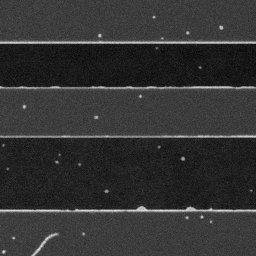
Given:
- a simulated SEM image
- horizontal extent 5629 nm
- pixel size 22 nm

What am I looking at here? lines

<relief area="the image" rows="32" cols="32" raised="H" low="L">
HHHHHHHHHHHHHHHHHHHHHHHHHHHHHHHH
HHHHHHHHHHHHHHHHHHHHHHHHHHHHHHHH
HHHHHHHHHHHHHHHHHHHHHHHHHHHHHHHH
HHHHHHHHHHHHHHHHHHHHHHHHHHHHHHHH
HHHHHHHHHHHHHHHHHHHHHHHHHHHHHHHH
LLLLLLLLLLLLLLLLLLLLLLLLLLLLLLLL
LLLLLLLLLLLLLLLLLLLLLLLLLLLLLLLL
LLLLLLLLLLLLLLLLLLLLLLLLLLLLLLLL
LLLLLLLLLLLLLLLLLLLLLLLLLLLLLLLL
LLLLLLLLLLLLLLLLLLLLLLLLLLLLLLLL
LLLLLLLLLLLLLLLLLLLLLLLLLLLLLLLL
HHHHHHHHHHHHHHHHHHHHHHHHHHHHHHHH
HHHHHHHHHHHHHHHHHHHHHHHHHHHHHHHH
HHHHHHHHHHHHHHHHHHHHHHHHHHHHHHHH
HHHHHHHHHHHHHHHHHHHHHHHHHHHHHHHH
HHHHHHHHHHHHHHHHHHHHHHHHHHHHHHHH
HHHHHHHHHHHHHHHHHHHHHHHHHHHHHHHH
LLLLLLLLLLLLLLLLLLLLLLLLLLLLLLLL
LLLLLLLLLLLLLLLLLLLLLLLLLLLLLLLL
LLLLLLLLLLLLLLLLLLLLLLLLLLLLLLLL
LLLLLLLLLLLLLLLLLLLLLLLLLLLLLLLL
LLLLLLLLLLLLLLLLLLLLLLLLLLLLLLLL
LLLLLLLLLLLLLLLLLLLLLLLLLLLLLLLL
LLLLLLLLLLLLLLLLLLLLLLLLLLLLLLLL
LLLLLLLLLLLLLLLLLLLLLLLLLLLLLLLL
LLLLLLLLLLLLLLLLLLLLLLLLLLLLLLLL
HHHHHHHHHHHHHHHHHHHHHHHHHHHHHHHH
HHHHHHHHHHHHHHHHHHHHHHHHHHHHHHHH
HHHHHHHHHHHHHHHHHHHHHHHHHHHHHHHH
HHHHHHHHHHHHHHHHHHHHHHHHHHHHHHHH
HHHHHHHHHHHHHHHHHHHHHHHHHHHHHHHH
HHHHHHHHHHHHHHHHHHHHHHHHHHHHHHHH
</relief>